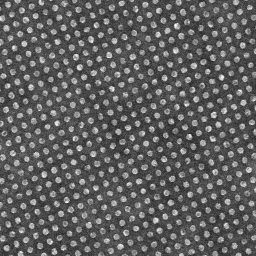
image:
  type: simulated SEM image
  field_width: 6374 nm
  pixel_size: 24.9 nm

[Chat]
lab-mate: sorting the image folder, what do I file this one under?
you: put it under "a regular array of raised bodies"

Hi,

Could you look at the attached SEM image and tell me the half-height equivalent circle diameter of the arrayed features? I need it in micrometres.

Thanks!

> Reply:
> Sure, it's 0.138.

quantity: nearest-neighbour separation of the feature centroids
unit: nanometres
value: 258